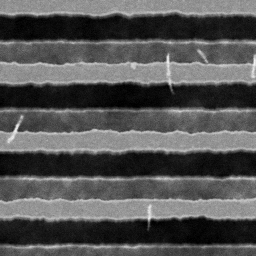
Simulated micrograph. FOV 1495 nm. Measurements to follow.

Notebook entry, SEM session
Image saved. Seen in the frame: lines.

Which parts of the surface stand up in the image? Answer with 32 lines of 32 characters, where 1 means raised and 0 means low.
11111111111111111111111111111111
11111111111111111111111111111111
00000000000000000000000000000000
00000000000000000000000000000000
00000000000000000000000000000000
11111111111111111111111111111111
11111111111111111111111111111111
11111111111111111111111111111111
11111111111111111111111111111111
11111111111111111111111111111111
01000000000000000000010000000000
00000000000000000000000000000000
00000000000000000000000000000000
00000000000000000000000000000000
11111111111111111111111111111111
11111111111111111111111111111111
11111111111111111111111111111111
11111111111111111111111111111111
11111111111111111111111111111111
00000000000000000000000000000000
00000000000000000000000000000000
00000000000000000000000000000000
11111111111111111111111111111111
11111111111111111111111111111111
11111111111111111111111111111111
11111111111111111111111111111111
11111111111111111111111111111111
00000000000000000000000000000000
00000000000000000000000000000000
00000000000000000000000000000000
00000000000000000000000000000000
11111111111111111111111111111111